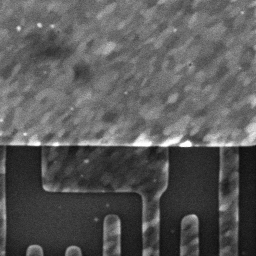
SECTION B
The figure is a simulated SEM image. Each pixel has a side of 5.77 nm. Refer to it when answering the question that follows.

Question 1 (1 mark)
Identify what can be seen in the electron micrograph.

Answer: wiring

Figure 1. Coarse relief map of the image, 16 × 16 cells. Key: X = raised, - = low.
XXXXXXXXXXXXXXXX
XXXXXXXXXXXXXXXX
XXXXXXXXXXXXXXXX
XXXXXXXXXXXXXXXX
XXXXXXXXXXXXXXXX
XXXXXXXXXXXXXXXX
XXXXXXXXXXXXXXXX
XXXXXXXXXXXXXXXX
XXXXXXXXXXXXXXXX
----------------
----------------
----------------
----------------
----------------
----------------
----------------